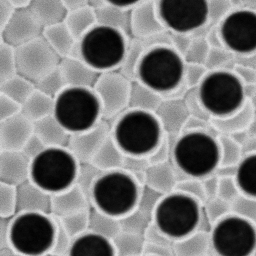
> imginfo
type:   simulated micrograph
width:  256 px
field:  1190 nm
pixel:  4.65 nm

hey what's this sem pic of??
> a regular array of holes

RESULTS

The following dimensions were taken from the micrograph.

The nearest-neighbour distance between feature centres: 64.5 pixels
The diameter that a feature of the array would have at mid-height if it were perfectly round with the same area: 0.188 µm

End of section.